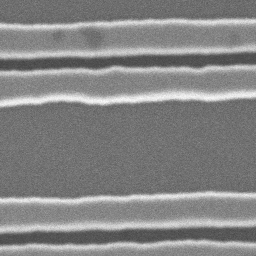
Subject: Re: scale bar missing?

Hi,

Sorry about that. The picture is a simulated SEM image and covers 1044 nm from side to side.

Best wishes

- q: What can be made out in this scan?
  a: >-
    lines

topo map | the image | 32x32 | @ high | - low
--------------------------------
--------------------------------
------------------@-@@@----@@@@@
@@@@@@@@@@@@@@@@@@@@@@@@@@@@@@@@
@@@@@@@@@@@@@@@@@@@@@@@@@@@@@@@@
@@@@@@@@@@@@@@@@@@@@@@@@@@@@@@@@
@@@@@@@@@@@@@@@@@@@@@@@@@@@@@---
--------------------------------
-------------@@@---@-@@@-@@@@@@@
@@@@@@@@@@@@@@@@@@@@@@@@@@@@@@@@
@@@@@@@@@@@@@@@@@@@@@@@@@@@@@@@@
@@@@@@@@@@@@@@@@@@@@@@@@@@@@@@@@
@@@@@@@@@@@@@@@@@@@-------------
--------------------------------
--------------------------------
--------------------------------
--------------------------------
--------------------------------
--------------------------------
--------------------------------
--------------------------------
--------------------------------
--------------------------------
--------------------------------
----------------@@@@@@@@@@@@@@@@
@@@@@@@@@@@@@@@@@@@@@@@@@@@@@@@@
@@@@@@@@@@@@@@@@@@@@@@@@@@@@@@@@
@@@@@@@@@@@@@@@@@@@@@@@@@@@@@@@@
@@@@@@@@@@@@@@@@----------------
--------------------------------
-------------@@@@@@@@@@@@@@@@@@@
@@@@@@@@@@@@@@@@@@@@@@@@@@@@@@@@